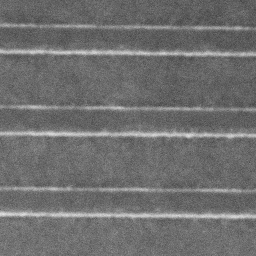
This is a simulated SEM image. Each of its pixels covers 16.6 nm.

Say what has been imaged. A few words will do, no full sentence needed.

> lines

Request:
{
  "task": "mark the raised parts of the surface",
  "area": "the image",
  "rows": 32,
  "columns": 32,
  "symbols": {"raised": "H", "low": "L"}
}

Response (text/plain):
LLLLLLLLLLLLLLLLLLLLLLLLLLLLLLLL
LLLLLLLLLLLLLLLLLLLLLLLLLLLLLLLL
LLLLLLLLLLLLLLLLLLLLLLLLLLLLLLLL
HHHHHHHHHHHHHHHHHHHHHHHHHHHHHHHL
HHHHHHHHHHHHHHHHHHHHHHHHHHHHHHHH
HHHHHHHHHHHHHHHHHHHHHHHHHHHHHHHH
HHHHHHHHHHHHHHHHHHHHHHHHHHHHHHHH
LLLLLLLLLLLLLLLLLLLLLLLLLLLLLLLL
LLLLLLLLLLLLLLLLLLLLLLLLLLLLLLLL
LLLLLLLLLLLLLLLLLLLLLLLLLLLLLLLL
LLLLLLLLLLLLLLLLLLLLLLLLLLLLLLLL
LLLLLLLLLLLLLLLLLLLLLLLLLLLLLLLL
LLLLLLLLLLLLLLLLLLLLLLLLLLLLLLLL
HHHHHHHHHHHHHHHHHLLLLLLLLLLLLLLL
HHHHHHHHHHHHHHHHHHHHHHHHHHHHHHHH
HHHHHHHHHHHHHHHHHHHHHHHHHHHHHHHH
HHHHHHHHHHHHHHHHHHHHHHHHHHHHHHHH
LLLLLLLLLLLLLLLLLLLLLLLLLLLLLLLL
LLLLLLLLLLLLLLLLLLLLLLLLLLLLLLLL
LLLLLLLLLLLLLLLLLLLLLLLLLLLLLLLL
LLLLLLLLLLLLLLLLLLLLLLLLLLLLLLLL
LLLLLLLLLLLLLLLLLLLLLLLLLLLLLLLL
LLLLLLLLLLLLLLLLLLLLLLLLLLLLLLLL
LLLLLLLLLLLLLLLLLLLLLLLLLLLLLLLL
HHHHHHHHHHHHHHHHHHHHHHHHHHHHHHHH
HHHHHHHHHHHHHHHHHHHHHHHHHHHHHHHH
HHHHHHHHHHHHHHHHHHHHHHHHHHHHHHHH
LLLLLLLLLLLLLLLLLLLLLLLLLLLLLLLL
LLLLLLLLLLLLLLLLLLLLLLLLLLLLLLLL
LLLLLLLLLLLLLLLLLLLLLLLLLLLLLLLL
LLLLLLLLLLLLLLLLLLLLLLLLLLLLLLLL
LLLLLLLLLLLLLLLLLLLLLLLLLLLLLLLL